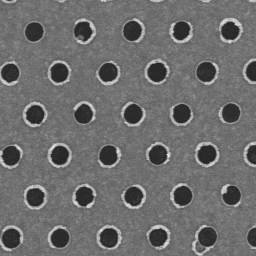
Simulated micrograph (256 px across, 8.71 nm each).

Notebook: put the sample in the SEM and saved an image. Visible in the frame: a regular array of holes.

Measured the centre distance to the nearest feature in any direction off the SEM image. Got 0.415 microns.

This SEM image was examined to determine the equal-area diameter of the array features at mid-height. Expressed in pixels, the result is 19.1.